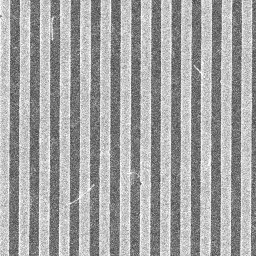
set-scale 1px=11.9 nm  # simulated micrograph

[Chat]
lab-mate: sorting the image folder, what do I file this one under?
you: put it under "parallel lines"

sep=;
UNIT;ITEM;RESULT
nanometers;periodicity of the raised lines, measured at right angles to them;241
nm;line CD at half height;118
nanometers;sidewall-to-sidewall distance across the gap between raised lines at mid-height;122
